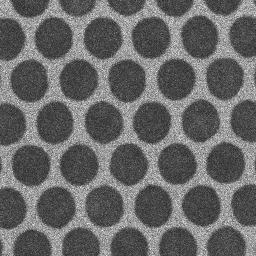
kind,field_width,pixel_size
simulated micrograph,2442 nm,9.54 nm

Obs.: a regular array of holes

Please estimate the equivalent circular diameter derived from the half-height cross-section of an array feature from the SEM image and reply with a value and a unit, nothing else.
0.384 um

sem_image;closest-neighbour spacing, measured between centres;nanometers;461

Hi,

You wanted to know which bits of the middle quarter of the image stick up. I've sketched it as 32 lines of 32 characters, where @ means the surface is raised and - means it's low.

-------@@@@@-------@@@@@--------
--------@@@---------@@@@--------
--------@@@---------@@@---------
---------@@----------@@---------
---------@@----------@@---------
--------@@@----------@@---------
--------@@@---------@@@@--------
-------@@@@@--------@@@@@------@
@-----@@@@@@@-----@@@@@@@@----@@
@@@@@@@@@--@@@@--@@@@--@@@@@@@@@
-@@@@@@------@@@@@@------@@@@@@-
-@@@@@--------@@@@--------@@@@--
--@@@---------@@@@---------@@@--
--@@@----------@@----------@@---
--@@@----------@@----------@@---
--@@@----------@@----------@@---
--@@@@---------@@@--------@@@@--
--@@@@--------@@@@--------@@@@--
-@@@@@@------@@@@@@------@@@@@@-
@@@@@@@@----@@@@@@@@----@@@@@@@@
@@----@@@@@@@@-----@@@@@@@-----@
@------@@@@@@-------@@@@@-------
--------@@@@--------@@@@--------
--------@@@@---------@@@--------
---------@@----------@@---------
---------@@----------@@---------
---------@@----------@@@--------
--------@@@@---------@@@--------
--------@@@@@-------@@@@@-------
@------@@@@@@@-----@@@@@@@-----@
@@@--@@@@---@@@@-@@@@---@@@@@@@@
-@@@@@@------@@@@@@------@@@@@@-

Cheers